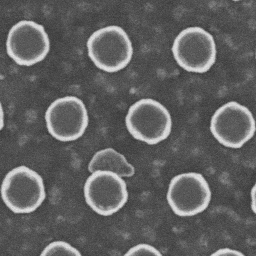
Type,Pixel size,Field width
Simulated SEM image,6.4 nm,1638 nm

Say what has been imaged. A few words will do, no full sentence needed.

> a regular array of raised bodies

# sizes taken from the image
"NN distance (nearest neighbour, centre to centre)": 526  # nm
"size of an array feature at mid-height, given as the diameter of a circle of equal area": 260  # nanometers